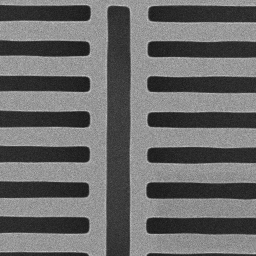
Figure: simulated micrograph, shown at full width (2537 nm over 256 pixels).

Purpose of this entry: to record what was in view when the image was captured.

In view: groups of lines, slits or small figures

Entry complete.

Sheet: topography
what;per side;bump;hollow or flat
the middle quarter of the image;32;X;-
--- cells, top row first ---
XXXXXXXXXXX------XXXXXXXXXXXXXXX
XXXXXXXXXXX------XXXXXXXXXXXXXXX
XXXXXXXXXXX------XXXXXXXXXXXXXXX
------XXXXX------XXXX-----------
------XXXXX------XXXX-----------
-------XXXX------XXXX-----------
------XXXXX------XXXX-----------
XXXXXXXXXXX------XXXXXXXXXXXXXXX
XXXXXXXXXXX------XXXXXXXXXXXXXXX
XXXXXXXXXXX------XXXXXXXXXXXXXXX
XXXXXXXXXXX------XXXXXXXXXXXXXXX
XXXXXXXXXXX------XXXXXXXXXXXXXXX
------XXXXX------XXXX-----------
-------XXXX------XXXX-----------
-------XXXX------XXXX-----------
------XXXXX------XXXX-----------
XXXXXXXXXXX------XXXXXXXXXXXXXXX
XXXXXXXXXXX------XXXXXXXXXXXXXXX
XXXXXXXXXXX------XXXXXXXXXXXXXXX
XXXXXXXXXXX------XXXXXXXXXXXXXXX
XXX--XXXXXX------XXXXXXXXXXXXXXX
------XXXXX------XXXX-----------
------XXXXX------XXXX-----------
------XXXXX------XXXX-----------
------XXXXX------XXXX-----------
XXXXXXXXXXX------XXXXXXXXXXXXXXX
XXXXXXXXXXX------XXXXXXXXXXXXXXX
XXXXXXXXXXX------XXXXXXXXXXXXXXX
XXXXXXXXXXX------XXXXXXXXXXXXXXX
XXXXXXXXXXX------XXXXXXXXXXXXXXX
------XXXXX------XXXX-----------
------XXXXX------XXX------------